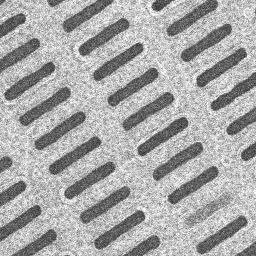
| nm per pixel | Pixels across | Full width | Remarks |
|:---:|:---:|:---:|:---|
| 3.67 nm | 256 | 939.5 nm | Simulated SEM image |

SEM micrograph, a regular array of holes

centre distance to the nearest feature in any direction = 106 nanometers